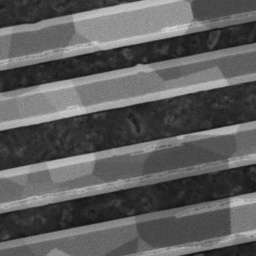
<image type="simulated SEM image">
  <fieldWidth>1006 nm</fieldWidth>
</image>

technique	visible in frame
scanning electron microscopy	one or a few lines or trenches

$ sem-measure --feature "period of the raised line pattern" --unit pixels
72.2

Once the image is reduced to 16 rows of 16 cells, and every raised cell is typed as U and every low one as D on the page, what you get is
DDDDDDDDUUUUUUUU
DDDUUUUUUUUUUUDD
UUUUUUUUUDDDDDDD
UUUDDDDDDDDDDUUU
DDDDDDDDUUUUUUUU
DDDUUUUUUUUUDDDD
UUUUUUUDDDDDDDDD
UUDDDDDDDDDDDDDD
DDDDDDDDDDDDUUUU
DDDDDDDUUUUUUUUU
DDUUUUUUUUUUUDDD
UUUUUUUUDDDDDDDD
UUUDDDDDDDDDDDUU
DDDDDDDDDDUUUUUU
DDDDDUUUUUUUUUUU
UUUUUUUUUUUUDDDD